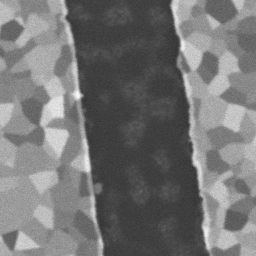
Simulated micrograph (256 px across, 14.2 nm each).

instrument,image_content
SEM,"one or a few lines or trenches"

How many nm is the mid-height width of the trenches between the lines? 1550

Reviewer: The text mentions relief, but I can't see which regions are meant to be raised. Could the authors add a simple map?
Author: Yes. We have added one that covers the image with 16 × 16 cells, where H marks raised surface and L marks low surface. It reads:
HHHHLLLLLLLHHHHH
HHHHLLLLLLLHHHHH
HHHHLLLLLLLHHHHH
HHHHHLLLLLLHHHHH
HHHHHLLLLLLHHHHH
HHHHHLLLLLLLHHHH
HHHHHLLLLLLLHHHH
HHHHHLLLLLLLHHHH
HHHHHLLLLLLLHHHH
HHHHHLLLLLLLHHHH
HHHHHHLLLLLLHHHH
HHHHHHLLLLLLHHHH
HHHHHHLLLLLLLHHH
HHHHHHLLLLLLLHHH
HHHHHHLLLLLLLHHH
HHHHHHLLLLLLLHHH